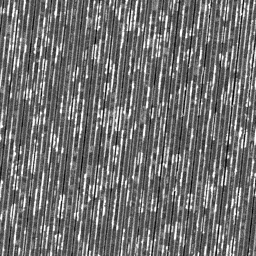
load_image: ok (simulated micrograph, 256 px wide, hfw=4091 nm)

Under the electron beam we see parallel lines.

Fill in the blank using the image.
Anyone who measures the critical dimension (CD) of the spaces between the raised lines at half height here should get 59.6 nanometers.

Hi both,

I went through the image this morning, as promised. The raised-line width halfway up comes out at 79.5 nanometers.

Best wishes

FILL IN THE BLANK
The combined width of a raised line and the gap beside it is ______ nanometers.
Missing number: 127